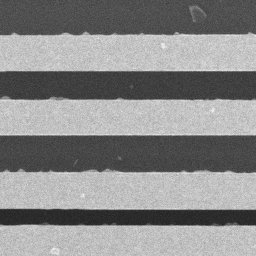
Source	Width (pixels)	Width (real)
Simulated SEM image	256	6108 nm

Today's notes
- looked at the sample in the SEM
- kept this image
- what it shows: lines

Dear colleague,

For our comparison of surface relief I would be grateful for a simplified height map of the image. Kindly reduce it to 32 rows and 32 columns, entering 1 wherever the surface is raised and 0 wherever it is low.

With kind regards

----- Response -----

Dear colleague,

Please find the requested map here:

00000000000000000000000000000000
00000000000000000000000000000000
00000000000000000000000000000000
00000000000000000000000000000000
00000000000000000011101111111111
11111111111111111111111111111111
11111111111111111111111111111111
11111111111111111111111111111111
11111111111111111111111111111111
00000000000000000000000000000000
00000000000000000000000000000000
00000000000000000000000000000000
00000000000000000000000000000000
11111111111111111111111111111111
11111111111111111111111111111111
11111111111111111111111111111111
11111111111111111111111111111111
00000000000000000000000000000000
00000000000000000000000000000000
00000000000000000000000000000000
00000000000000000000000000000000
00000000000000000000000000000000
11111111111111111111111111111111
11111111111111111111111111111111
11111111111111111111111111111111
11111111111111111111111111111111
00000000000000000000000000000000
00000000000000000000000000000000
11111111111111111111111111111111
11111111111111111111111111111111
11111111111111111111111111111111
11111111111111111111111111111111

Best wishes